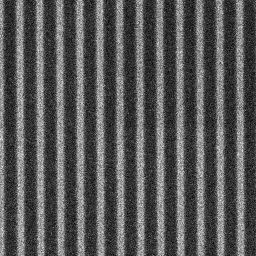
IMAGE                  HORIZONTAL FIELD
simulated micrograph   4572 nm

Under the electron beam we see parallel lines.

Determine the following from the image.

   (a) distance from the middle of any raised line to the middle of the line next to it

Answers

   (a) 357 nanometres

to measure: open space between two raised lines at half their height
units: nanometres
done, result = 230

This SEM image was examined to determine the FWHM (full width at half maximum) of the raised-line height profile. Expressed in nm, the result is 141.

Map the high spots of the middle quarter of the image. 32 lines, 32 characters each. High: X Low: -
---XX---XX---XX---XX---XX---XX--
---XX---XX---XX---XX---XX---XX--
---XX---XX---XX---XX---XX---XX--
---XX---XX---XX---XX---XX---XX--
---XX---XX---XX---XX---XX---XX--
---XX---XX---XX---XX---XX---XX--
---XX---XX---XX---XX---XX---XX--
---XX---XX---XX---XX---XX---XX--
---XX---XX---XX---XX---XX---XX--
---XX---XX---XX---XX---XX---XX--
---XX---XX---XX---XX---XX---XX--
---XX---XX---XX---XX---XX---XX--
---XX---XX---XX---XX---XX---XX--
---XX---XX---XX---XX---XX---XX--
---XX---XX---XX---XX---XX---XX--
---XX---XX---XX---XX---XX---XX--
---XX---XX---XX---XX---XX---XX--
---XX---XX---XX---XX---XX---XX--
---XX---XX---XX---XX---XX---XX--
---XX---XX---XX---XX---XX---XX--
---XX---XX---XX---XX---XX---XX--
---XX---XX---XX---XX---XX---XX--
---XX---XX---XX---XX---XX---XX--
---XX---XX---XX---XX---XX---XX--
---XX---XX---XX---XX---XX---XX--
---XX---XX---XX---XX---XX---XX--
---XX---XX---XX---XX---XX---XX--
---XX---XX---XX---XX---XX---XX--
---XX---XX---XX---XX---XX---XX--
---XX---XX---XX---XX---XX---XX--
---XX---XX---XX---XX---XX---XX--
---XX---XX---XX---XX---XX---XX--